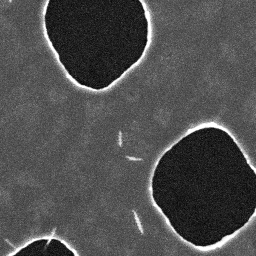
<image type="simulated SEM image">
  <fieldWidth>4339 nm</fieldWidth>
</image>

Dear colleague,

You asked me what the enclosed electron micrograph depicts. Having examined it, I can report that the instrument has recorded holes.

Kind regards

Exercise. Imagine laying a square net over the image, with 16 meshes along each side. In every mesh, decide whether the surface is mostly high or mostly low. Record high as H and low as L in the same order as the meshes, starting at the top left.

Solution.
HHHLLLLLLHHHHHHH
HHHLLLLLLHHHHHHH
HHHLLLLLLHHHHHHH
HHHHLLLLLHHHHHHH
HHHHLLLLHHHHHHHH
HHHHHHLHHHHHHHHH
HHHHHHHHHHHHHHHH
HHHHHHHHHHHHHHHH
HHHHHHHHHHHHLLHH
HHHHHHHHHHLLLLLH
HHHHHHHHHHLLLLLL
HHHHHHHHHLLLLLLL
HHHHHHHHHHLLLLLL
HHHHHHHHHHLLLLLL
HHHHHHHHHHHLLLLH
HLLLHHHHHHHHHHHH